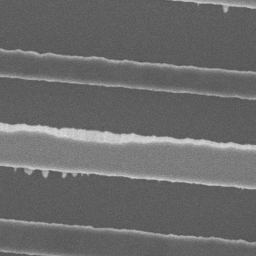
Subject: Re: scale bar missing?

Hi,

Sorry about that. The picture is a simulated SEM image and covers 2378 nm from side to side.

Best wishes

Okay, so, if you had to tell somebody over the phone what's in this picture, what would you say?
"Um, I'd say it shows lines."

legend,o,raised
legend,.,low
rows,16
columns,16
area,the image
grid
................
................
................
ooooo...........
oooooooooooooooo
........oooooooo
................
................
ooooooo.........
oooooooooooooooo
..oooooooooooooo
............oooo
................
................
ooooooooo.......
oooooooooooooooo